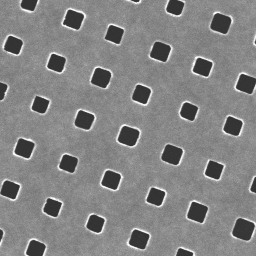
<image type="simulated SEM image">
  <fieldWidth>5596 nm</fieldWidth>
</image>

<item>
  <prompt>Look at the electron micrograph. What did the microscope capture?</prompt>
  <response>a regular array of holes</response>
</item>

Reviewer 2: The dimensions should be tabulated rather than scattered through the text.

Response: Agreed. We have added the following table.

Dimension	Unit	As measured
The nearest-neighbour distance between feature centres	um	0.982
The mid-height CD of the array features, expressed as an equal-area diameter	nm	407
